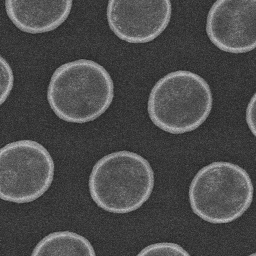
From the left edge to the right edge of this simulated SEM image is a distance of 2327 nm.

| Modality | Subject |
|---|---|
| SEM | raised bodies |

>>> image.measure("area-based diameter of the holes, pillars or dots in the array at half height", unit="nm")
542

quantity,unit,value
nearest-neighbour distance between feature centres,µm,0.903